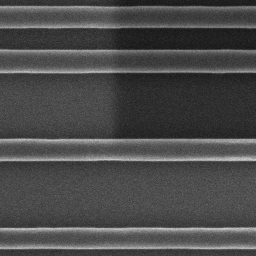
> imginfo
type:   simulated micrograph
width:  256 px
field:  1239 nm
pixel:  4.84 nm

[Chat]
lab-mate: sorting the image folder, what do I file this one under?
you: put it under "wiring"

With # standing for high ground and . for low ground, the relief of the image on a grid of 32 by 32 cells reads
................................
################################
################################
................................
................................
................................
################################
################################
################################
................................
................................
................................
................................
................................
................................
................................
................................
######.#########################
################################
################################
................................
................................
................................
................................
................................
................................
................................
................................
................................
################################
################################
................................